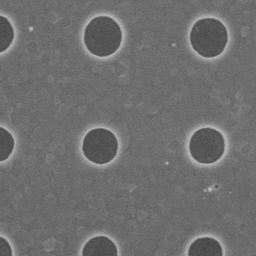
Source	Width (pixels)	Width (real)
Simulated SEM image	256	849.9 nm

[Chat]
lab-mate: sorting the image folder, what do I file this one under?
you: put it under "holes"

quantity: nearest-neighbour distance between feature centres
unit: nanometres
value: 354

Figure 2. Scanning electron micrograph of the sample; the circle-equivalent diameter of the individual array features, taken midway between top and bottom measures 124 nanometers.